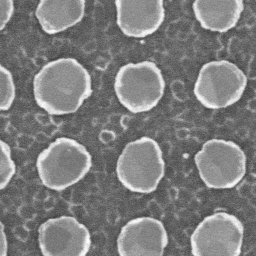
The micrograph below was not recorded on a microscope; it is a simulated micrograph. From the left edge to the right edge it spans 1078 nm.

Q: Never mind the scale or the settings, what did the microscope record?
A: raised bodies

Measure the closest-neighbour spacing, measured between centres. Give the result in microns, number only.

0.327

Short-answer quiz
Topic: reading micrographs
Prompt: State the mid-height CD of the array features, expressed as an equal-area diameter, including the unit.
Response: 0.205 um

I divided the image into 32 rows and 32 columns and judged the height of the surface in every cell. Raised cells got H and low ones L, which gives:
HHLLLHHHHHHLLLLHHHHHLLLLHHHHHHLL
HLLLHHHHHHLLLLLHHHHHLLLLHHHHHHLL
HLLLLHHHHHLLLLLHHHHHLLLLLHHHHHLL
LLLLLHHHLLLLLLLHHHHLLLLLLLHHHLLL
LLLLLLLLLLLLLLLLHHLLLLLLLLLLLLLL
LLLLLLLLLLLLLLLLLLLLLLLLLLLLLLLL
LLLLLLLLLLLLLLLLLLLLLLLLLLLLLLLL
LLLLLLLHHLLLLLLLLLLLLLLLLLLLLLLL
LLLLLLHHHHLLLLLHHHHLLLLLLHHHHHLL
HLLLLHHHHHHLLLLHHHHHLLLLLHHHHHHL
HHLLHHHHHHHLLLHHHHHHLLLLLHHHHHHL
HHLLHHHHHHHLLLLHHHHHLLLLHHHHHHLL
HLLLLHHHHHLLLLLHHHHHLLLLLHHHHHLL
LLLLLLHHHHLLLLLLHHHLLLLLLLLLLLLL
LLLLLLLLLLLLLLLLLLLLLLLLLLLLLLLL
LLLLLLLLLLLLLLLLLLLLLLLLLLLLLLLL
LLLLLLLLLLLLLLLLLLLLLLLLLLLLLLLL
LLLLLLLHHLLLLLLLLLLLLLLLLLLLLLLL
LLLLLLHHHHLLLLLLHHHHLLLLLHHHHHLL
HLLLLHHHHHHLLLLHHHHHLLLLHHHHHHHL
HHLLLHHHHHHLLLLHHHHHLLLLLHHHHHHL
HHLLLHHHHHHLLLLHHHHHLLLLLHHHHHHL
HLLLLHHHHHLLLLLHHHHHLLLLLHHHHHLL
LLLLLLLHLLLLLLLLHHHLLLLLLLLLLLLL
LLLLLLLLLLLLLLLLLLLLLLLLLLLLLLLL
LLLLLLLLLLLLLLLLLLLLLLLLLLLLLLLL
LLLLLLLLLLLLLLLLLLLLLLLLLLLLLLLL
LLLLLLHHHLLLLLLLLHHLLLLLLLHHHLLL
LLLLLHHHHHHLLLLLHHHHLLLLLHHHHHLL
HLLLLHHHHHHLLLLHHHHHHLLLHHHHHHLL
HLLLLHHHHHHLLLLHHHHHHLLLHHHHHHLL
HLLLLHHHHHHLLLLHHHHHLLLLHHHHHHLL